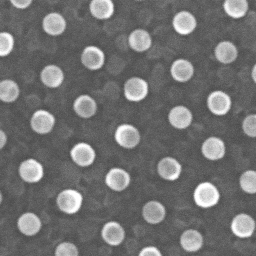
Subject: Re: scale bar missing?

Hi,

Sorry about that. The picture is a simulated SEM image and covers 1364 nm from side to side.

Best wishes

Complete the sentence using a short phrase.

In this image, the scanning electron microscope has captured a regular array of raised bodies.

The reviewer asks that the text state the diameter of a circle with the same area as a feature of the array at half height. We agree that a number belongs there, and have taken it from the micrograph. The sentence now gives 116 nanometres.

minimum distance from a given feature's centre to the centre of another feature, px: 44.4